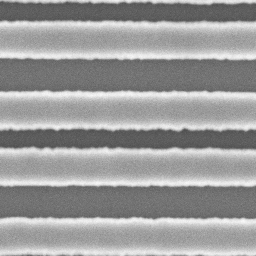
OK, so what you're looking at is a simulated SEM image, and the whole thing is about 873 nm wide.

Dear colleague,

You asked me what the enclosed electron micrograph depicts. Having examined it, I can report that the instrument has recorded lines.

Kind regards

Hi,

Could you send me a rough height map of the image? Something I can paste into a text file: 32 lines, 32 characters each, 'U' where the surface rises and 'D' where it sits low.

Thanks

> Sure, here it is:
DDDDDDDDDDDDDDDDDDDDDDDDDDDDDDDD
DDDDDDDDDDDDDDDDDDDDDDDDDDDDDDDD
DDDDDDDDDDDDDDDDDDDDDDDDDDDDDDDD
UUUUUUUUUUUUUUUUUUUUUUUUUUUUUUUU
UUUUUUUUUUUUUUUUUUUUUUUUUUUUUUUU
UUUUUUUUUUUUUUUUUUUUUUUUUUUUUUUU
UUUUUUUUUUUUUUUUUUUUUUUUUUUUUUUU
DDDDDDDDDDDDDDDDDDDDDDDDDDDDDDDD
DDDDDDDDDDDDDDDDDDDDDDDDDDDDDDDD
DDDDDDDDDDDDDDDDDDDDDDDDDDDDDDDD
DDDDDDDDDDDDDDDDDDDDDDDDDDDDDDDD
UUUDUUUUUUUDUDUUUDUDDUUDUUDUDDDD
UUUUUUUUUUUUUUUUUUUUUUUUUUUUUUUU
UUUUUUUUUUUUUUUUUUUUUUUUUUUUUUUU
UUUUUUUUUUUUUUUUUUUUUUUUUUUUUUUU
UUUUUUUUUUUUUUUUUUUUUUUUUUUUUUUU
DDDDDDDDDDDDDDDDDDDDDDDDDDDDDDDD
DDDDDDDDDDDDDDDDDDDDDDDDDDDDDDDD
DDDUDDDDDDDDDDDDDDDDDDDDDDDDDDDD
UUUUUUUUUUUUUUUUUUUUUUUUUUUUUUUU
UUUUUUUUUUUUUUUUUUUUUUUUUUUUUUUU
UUUUUUUUUUUUUUUUUUUUUUUUUUUUUUUU
UUUUUUUUUUUUUUUUUUUUUUUUUUUUUUUU
DDDDDDDDDDDDDDDDDDDDDDDDDDDDDDDD
DDDDDDDDDDDDDDDDDDDDDDDDDDDDDDDD
DDDDDDDDDDDDDDDDDDDDDDDDDDDDDDDD
DDDDDDDDDDDDDDDDDDDDDDDDDDDDDDDD
UUUUUUUUUUUUUUUUUUUUUUUUUUUUUUUU
UUUUUUUUUUUUUUUUUUUUUUUUUUUUUUUU
UUUUUUUUUUUUUUUUUUUUUUUUUUUUUUUU
UUUUUUUUUUUUUUUUUUUUUUUUUUUUUUUU
UUUUUUUUUUUUUUUUUUUUUUUUUUUUUUUU